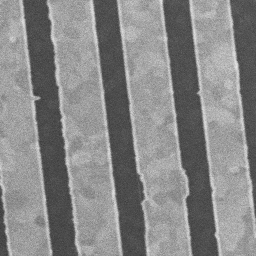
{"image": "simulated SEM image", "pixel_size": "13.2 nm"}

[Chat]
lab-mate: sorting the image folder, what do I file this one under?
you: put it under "one or a few lines or trenches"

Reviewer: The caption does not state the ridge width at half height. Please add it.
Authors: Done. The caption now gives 544 nm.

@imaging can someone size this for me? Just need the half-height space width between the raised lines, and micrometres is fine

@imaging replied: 0.375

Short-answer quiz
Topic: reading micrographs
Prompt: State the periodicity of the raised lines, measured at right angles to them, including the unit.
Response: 912 nm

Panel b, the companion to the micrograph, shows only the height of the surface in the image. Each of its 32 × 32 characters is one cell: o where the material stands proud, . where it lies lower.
ooo...ooooo....ooooo....ooooo...
ooo...oooooo...ooooo....ooooo...
ooo....ooooo...ooooo....ooooo...
ooo....ooooo...ooooo....ooooo...
ooo....ooooo...oooooo...ooooo...
ooo....ooooo...oooooo....oooo...
ooo....ooooo....ooooo....oooo...
ooo....ooooo....ooooo....oooo...
oooo...ooooo....ooooo....ooooo..
oooo...ooooo....ooooo....ooooo..
oooo...oooooo...ooooo....ooooo..
oooo....ooooo...ooooo....ooooo..
oooo....ooooo...oooooo...ooooo..
oooo....ooooo...oooooo...ooooo..
oooo....ooooo....ooooo....oooo..
oooo....ooooo....ooooo....oooo..
ooooo...ooooo....ooooo....oooo..
ooooo...ooooo....ooooo....ooooo.
ooooo...oooooo...ooooo....ooooo.
ooooo...oooooo...ooooo....ooooo.
ooooo...oooooo...oooooo...ooooo.
ooooo....ooooo...oooooo...ooooo.
ooooo....ooooo....ooooo...ooooo.
ooooo....ooooo....ooooo....oooo.
ooooo....ooooo....ooooo....oooo.
.ooooo...ooooo....ooooo....oooo.
.ooooo...ooooo....ooooo....ooooo
.ooooo...oooooo...ooooo....ooooo
.ooooo....ooooo...ooooo....ooooo
.ooooo....ooooo...oooooo...ooooo
.ooooo....ooooo...oooooo...ooooo
.ooooo....ooooo....ooooo....oooo